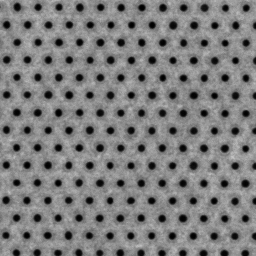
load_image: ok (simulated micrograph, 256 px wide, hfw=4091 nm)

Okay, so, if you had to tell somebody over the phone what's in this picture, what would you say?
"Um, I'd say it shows a regular array of holes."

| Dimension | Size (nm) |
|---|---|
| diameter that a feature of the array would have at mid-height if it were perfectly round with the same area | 121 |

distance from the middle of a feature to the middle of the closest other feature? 322 nm